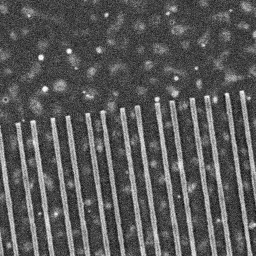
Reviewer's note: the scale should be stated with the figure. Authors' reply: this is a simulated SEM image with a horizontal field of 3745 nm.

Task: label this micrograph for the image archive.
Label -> parallel lines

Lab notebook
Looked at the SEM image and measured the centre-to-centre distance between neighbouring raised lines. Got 0.257 um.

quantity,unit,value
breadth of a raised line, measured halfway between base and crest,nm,61.5